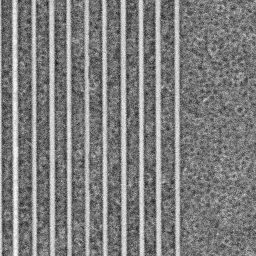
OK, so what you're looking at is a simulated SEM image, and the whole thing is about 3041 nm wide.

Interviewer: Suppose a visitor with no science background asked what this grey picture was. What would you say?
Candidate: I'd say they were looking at parallel lines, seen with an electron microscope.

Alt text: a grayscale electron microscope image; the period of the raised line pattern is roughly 213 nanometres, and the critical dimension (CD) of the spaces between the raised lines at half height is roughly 171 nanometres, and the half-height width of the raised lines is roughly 46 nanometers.